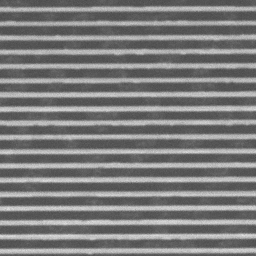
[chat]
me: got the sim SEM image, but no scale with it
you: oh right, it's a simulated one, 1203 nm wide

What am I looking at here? parallel lines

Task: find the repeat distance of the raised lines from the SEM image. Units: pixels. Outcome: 14.2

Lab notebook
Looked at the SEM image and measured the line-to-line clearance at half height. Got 49.9 nm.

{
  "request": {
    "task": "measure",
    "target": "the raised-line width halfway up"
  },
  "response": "16.4 nm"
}